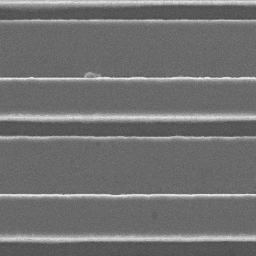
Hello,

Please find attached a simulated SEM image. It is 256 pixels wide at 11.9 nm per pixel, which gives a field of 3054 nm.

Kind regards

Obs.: lines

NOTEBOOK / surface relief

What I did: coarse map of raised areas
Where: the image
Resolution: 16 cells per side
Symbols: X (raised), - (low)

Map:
----------------
XXXXXXXXXXXXXXXX
XXXXXXXXXXXXXXXX
XXXXXXXXXXXXXXXX
XXXXXXXXXXXXXXXX
XXXXXXXXXXXXXXXX
XXXXXXXXXXXXXXXX
----------------
----------------
XXXXXXXXXXXXXXXX
XXXXXXXXXXXXXXXX
XXXXXXXXXXXXXXXX
XXXXXXXXXXXXXXXX
XXXXXXXXXXXXXXXX
XXXXXXXXXXXXXXXX
----------------